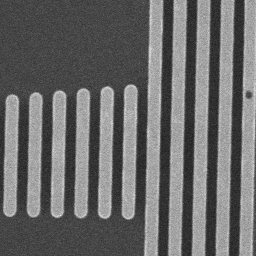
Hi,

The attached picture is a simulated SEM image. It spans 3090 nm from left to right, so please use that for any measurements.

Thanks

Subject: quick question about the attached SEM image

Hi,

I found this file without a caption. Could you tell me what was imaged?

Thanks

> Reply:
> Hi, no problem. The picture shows groups of lines, slits or small figures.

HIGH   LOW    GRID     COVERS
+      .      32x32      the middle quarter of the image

.....................+++...+++..
.....................+++...+++..
.....................+++...+++..
.....................+++...+++..
.....................+++...+++..
................+....+++...+++..
....++....++...+++...+++...+++..
...+++...+++...+++...+++...+++..
...+++...+++...+++...+++...+++..
...+++...+++...+++...+++...+++..
...+++...+++...+++...+++...+++..
...+++...+++...+++...+++...+++..
...+++...+++...+++...+++...+++..
...+++...+++...+++...+++...+++..
...+++...+++...+++...+++...+++..
...+++...+++...+++...+++...+++..
...+++...+++...+++...+++...+++..
...+++...+++...+++...+++...+++..
...+++...+++...+++...+++...+++..
...+++...+++...+++...+++...+++..
...+++...+++...+++...+++...+++..
...+++...+++...+++...+++...+++..
...+++...+++...+++...+++...+++..
...+++...+++...+++...+++...+++..
...+++...+++...+++...+++...+++..
...+++...+++...+++...+++...+++..
...+++...+++...+++...+++...+++..
...+++...+++...+++...+++...+++..
...+++...+++...+++...+++...+++..
...+++...+++...+++...+++...+++..
...+++...+++...+++...+++..+++...
...+++...+++...+++...+++..+++...